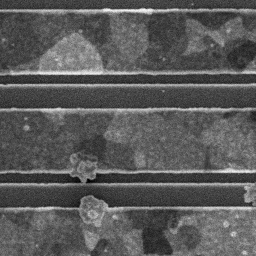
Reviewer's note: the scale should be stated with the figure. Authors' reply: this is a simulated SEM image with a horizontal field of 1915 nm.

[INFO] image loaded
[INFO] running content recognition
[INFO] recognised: lines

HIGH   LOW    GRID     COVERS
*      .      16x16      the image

................
****************
****************
****************
****************
................
................
****************
****************
****************
****************
................
.....*..........
****************
****************
****************